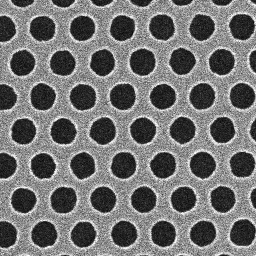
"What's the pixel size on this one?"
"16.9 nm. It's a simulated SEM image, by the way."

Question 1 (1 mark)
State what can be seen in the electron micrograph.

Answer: a regular array of holes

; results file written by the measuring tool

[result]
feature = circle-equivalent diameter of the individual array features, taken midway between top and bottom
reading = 444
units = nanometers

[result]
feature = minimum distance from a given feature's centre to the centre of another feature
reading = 666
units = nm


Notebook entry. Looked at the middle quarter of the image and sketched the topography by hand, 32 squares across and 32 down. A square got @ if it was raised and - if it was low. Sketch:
---@@@-------@@@@------@@@@-----
---@@@@-----@@@@@-----@@@@@-----
--@@@@@@---@@@@@@@---@@@@@@@---@
@@@@@@@@@@@@@@@@@@@@@@@@@@@@@@@@
@@@@@@@@@@@@@@@@@@@@@@@@@@@@@@@@
@@@----@@@@@-----@@@@@@----@@@@@
@@------@@@@------@@@@------@@@@
@-------@@@-------@@@-------@@@-
@-------@@@-------@@@-------@@@-
@@------@@@@------@@@@------@@@@
@@------@@@@-----@@@@@-----@@@@@
@@@@--@@@@@@@@--@@@@@@@@-@@@@@@@
@@@@@@@@@@@@@@@@@@@@@@@@@@@@@@@@
@@@@@@@@@--@@@@@@@---@@@@@@@---@
--@@@@@@----@@@@@-----@@@@@-----
---@@@@------@@@@------@@@@-----
---@@@-------@@@@------@@@------
---@@@-------@@@@------@@@------
---@@@@------@@@@-----@@@@@-----
--@@@@@@----@@@@@@----@@@@@@---@
@@@@@@@@@@@@@@@@@@@@@@@@@@@@@@@@
@@@@@@@@@@@@@@@@@@@@@@@@@@@@@@@@
@@@@--@@@@@@@----@@@@@@----@@@@@
@@-----@@@@@------@@@@------@@@@
@-------@@@@------@@@@------@@@-
@-------@@@@------@@@-------@@@-
@@------@@@@------@@@@------@@@@
@@-----@@@@@-----@@@@@-----@@@@@
@@@--@@@@@@@@@--@@@@@@@---@@@@@@
@@@@@@@@@@@@@@@@@@@@@@@@@@@@@@@@
@@@@@@@@@@@@@@@@@@@@@@@@@@@@@@@@
--@@@@@@----@@@@@@----@@@@@@----